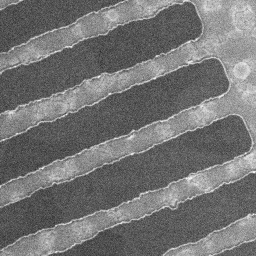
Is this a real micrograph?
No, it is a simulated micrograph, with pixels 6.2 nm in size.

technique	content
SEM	one or a few lines or trenches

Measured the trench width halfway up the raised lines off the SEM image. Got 128 nm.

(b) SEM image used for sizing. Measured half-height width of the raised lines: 252 nm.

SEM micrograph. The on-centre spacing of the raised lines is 380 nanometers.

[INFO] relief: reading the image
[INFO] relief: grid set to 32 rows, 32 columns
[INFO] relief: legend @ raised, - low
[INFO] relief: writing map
-@@@@@@@@@@@@@@-------@@--------
@@@@@@@@@@@@--------@@@@@-------
@@@@@@@@@@-------@@@@@@@@-------
@@@@@@@@------@@@@@@@@@@@-------
@@@@@-------@@@@@@@@@@@@@----@--
@@@------@@@@@@@@@@@@@@---------
@------@@@@@@@@@@@@@@-----------
-----@@@@@@@@@@@@@@------@@-----
-@@@@@@@@@@@@@@@------@@@@@@-@@-
@@@@@@@@@@@@--------@@@@@@@@--@-
@@@@@@@@@@-------@@@@@@@@@@@@---
@@@@@@@@-------@@@@@@@@@@@@@----
@@@@@--------@@@@@@@@@@@@@------
@@--------@@@@@@@@@@@@@@--------
--------@@@@@@@@@@@@@@------@@--
-----@@@@@@@@@@@@@@-------@@@@@-
---@@@@@@@@@@@@@@------@@@@@@@@-
@@@@@@@@@@@@@@-------@@@@@@@@@@@
@@@@@@@@@@@--------@@@@@@@@@@@@-
@@@@@@@@@-------@@@@@@@@@@@@@@--
@@@@@@-------@@@@@@@@@@@@@@@----
@@@@-------@@@@@@@@@@@@@@-------
@@-------@@@@@@@@@@@@@@-------@@
-----@@@@@@@@@@@@@@@@------@@@@@
---@@@@@@@@@@@@@@@------@@@@@@@@
-@@@@@@@@@@@@@@-------@@@@@@@@@@
@@@@@@@@@@@@-------@@@@@@@@@@@@@
@@@@@@@@@--------@@@@@@@@@@@@@--
@@@@@@@------@@@@@@@@@@@@@@@----
@@@@--------@@@@@@@@@@@@@@------
@@-------@@@@@@@@@@@@@@@------@@
-------@@@@@@@@@@@@@@-------@@@@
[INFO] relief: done